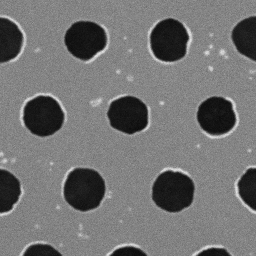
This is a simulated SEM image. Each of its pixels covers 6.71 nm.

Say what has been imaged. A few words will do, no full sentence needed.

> holes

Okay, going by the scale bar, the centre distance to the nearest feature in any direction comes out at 564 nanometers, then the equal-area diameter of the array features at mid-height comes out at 272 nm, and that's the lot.